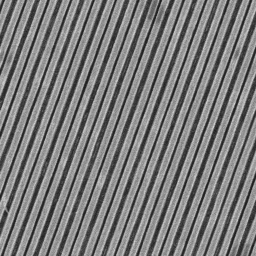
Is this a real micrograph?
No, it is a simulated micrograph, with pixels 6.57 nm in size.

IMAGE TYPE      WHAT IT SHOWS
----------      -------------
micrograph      parallel lines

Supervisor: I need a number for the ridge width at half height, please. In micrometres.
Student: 0.0456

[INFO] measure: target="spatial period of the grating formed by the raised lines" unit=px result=10.6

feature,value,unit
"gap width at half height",4.35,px